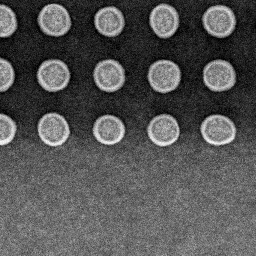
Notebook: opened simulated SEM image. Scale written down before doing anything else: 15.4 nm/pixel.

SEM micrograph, a regular array of raised bodies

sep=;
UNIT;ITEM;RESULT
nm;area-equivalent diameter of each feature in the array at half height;456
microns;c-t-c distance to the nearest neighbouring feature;0.835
